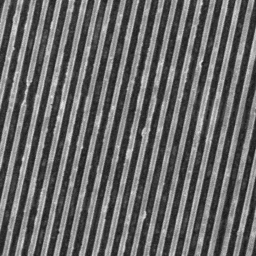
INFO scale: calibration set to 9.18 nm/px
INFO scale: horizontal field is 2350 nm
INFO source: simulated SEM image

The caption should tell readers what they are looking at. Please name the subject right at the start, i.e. parallel lines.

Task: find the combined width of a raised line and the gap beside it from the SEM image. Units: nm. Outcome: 115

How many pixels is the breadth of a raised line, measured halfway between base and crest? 4.4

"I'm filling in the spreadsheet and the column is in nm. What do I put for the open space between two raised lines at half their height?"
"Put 71.8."